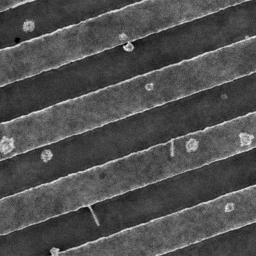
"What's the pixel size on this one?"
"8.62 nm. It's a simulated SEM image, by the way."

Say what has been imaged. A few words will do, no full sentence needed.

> lines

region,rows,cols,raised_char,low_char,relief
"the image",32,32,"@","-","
@@@--------------@@@@@@@@@@@@@--
--------------@@@@@@@@@@@@@-----
-----------@@@@@@@@@@@@@--------
--------@@@@@@@@@@@@@-----------
-----@@@@@@@@@@@@@--------------
--@@@@@@@@@@@@@@@------------@@@
@@@@@@@@@@@@@-------------@@@@@@
@@@@@@@@@@--------------@@@@@@@@
@@@@@@@-------------@@@@@@@@@@@@
@@@@-------------@@@@@@@@@@@@@--
@--------------@@@@@@@@@@@@@----
------------@@@@@@@@@@@@@-------
--------@@@@@@@@@@@@@@----------
------@@@@@@@@@@@@@-------------
---@@@@@@@@@@@@@---------------@
@@@@@@@@@@@@@--------------@@@@@
@@@@@@@@@@---------------@@@@@@@
@@@@@@@@--------------@@@@@@@@@@
@@@@---------------@@@@@@@@@@@@@
@@--------------@@@@@@@@@@@@@---
-------------@@@@@@@@@@@@@------
----------@@@@@@@@@@@@@---------
-------@@@@@@@@@@@@@------------
----@@@@@@@@@@@@@--------------@
-@@@@@@@@@@@@@--------------@@@@
@@@@@@@@@@@@-------------@@@@@@@
@@@@@@@@@-------------@@@@@@@@@@
@@@@@@-------------@@@@@@@@@@@@@
@@@-------------@@@@@@@@@@@@@@--
--------------@@@@@@@@@@@@@-----
-----------@@@@@@@@@@@@@--------
------@@@@@@@@@@@@@@@-----------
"